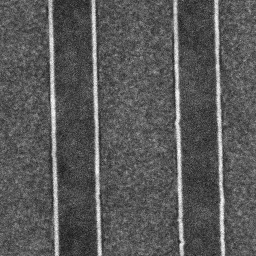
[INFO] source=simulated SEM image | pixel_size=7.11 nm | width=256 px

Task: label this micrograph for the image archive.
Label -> one or a few lines or trenches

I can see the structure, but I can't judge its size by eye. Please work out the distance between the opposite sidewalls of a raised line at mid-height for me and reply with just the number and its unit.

306 nanometres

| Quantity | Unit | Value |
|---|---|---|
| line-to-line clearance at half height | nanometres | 575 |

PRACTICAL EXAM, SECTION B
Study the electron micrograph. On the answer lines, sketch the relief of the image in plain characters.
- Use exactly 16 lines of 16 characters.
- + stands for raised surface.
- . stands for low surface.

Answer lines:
...+++.....+++..
...+++.....+++..
...+++.....+++..
...+++.....+++..
...+++.....+++..
...+++.....+++..
...+++.....+++..
...+++.....+++..
...+++.....+++..
...+++.....+++..
...+++.....+++..
...+++.....+++..
...+++.....+++..
...+++.....+++..
....++.....+++..
....++.....+++..